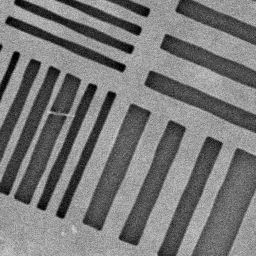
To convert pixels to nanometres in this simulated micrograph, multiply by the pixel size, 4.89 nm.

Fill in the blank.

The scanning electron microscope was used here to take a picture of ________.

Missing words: groups of lines, slits or small figures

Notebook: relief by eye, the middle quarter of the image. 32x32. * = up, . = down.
**********.....*****************
*************..*****************
*.*******************...********
....*****************......*****
....****************.........***
....**..************............
....*...**************..........
...**...***..***********........
...*...***...**************.....
..**...***..******************..
..*...***...****...*************
..*...***...****.....***********
.**...**...****.......**********
.*...***...****......***********
**...***..*****......*****..****
*...***...****.......*****....**
*...***..*****......*****......*
*...**...****.......*****.....**
...***...****......*****......**
...**...****.......*****.....***
..***...****......*****......***
..**....****......*****......***
.***...****.......*****.....****
.***...****......*****......****
.**...****.......*****.....*****
***...****......******.....*****
***..*****......*****......*****
**...****.......*****.....******
**..*****......*****......*****.
*...****.......*****.....******.
*...****......*****......*****..
...*****......*****.....******..